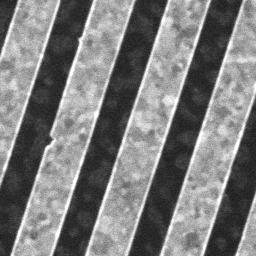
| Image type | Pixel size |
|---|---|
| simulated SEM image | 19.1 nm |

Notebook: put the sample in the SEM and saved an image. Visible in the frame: one or a few lines or trenches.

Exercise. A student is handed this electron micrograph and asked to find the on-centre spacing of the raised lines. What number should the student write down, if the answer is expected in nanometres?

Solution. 1360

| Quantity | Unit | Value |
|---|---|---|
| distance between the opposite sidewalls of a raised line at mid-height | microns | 0.726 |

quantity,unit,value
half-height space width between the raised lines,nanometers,642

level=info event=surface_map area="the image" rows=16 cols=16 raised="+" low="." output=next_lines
.+++..++..+++..+
.++..+++..+++..+
+++..+++..++..++
+++..++..+++..++
++..+++..+++..++
++..+++..++..+++
++..++..+++..+++
+...++..+++..++.
+..+++..++..+++.
+..++..+++..+++.
..+++..+++..++..
..+++..++...++..
..++..+++..+++..
..++..+++..++...
.+++..++...++..+
.++..+++..+++..+